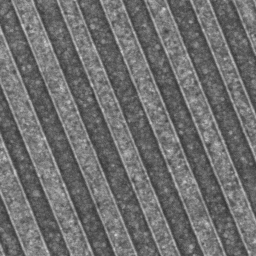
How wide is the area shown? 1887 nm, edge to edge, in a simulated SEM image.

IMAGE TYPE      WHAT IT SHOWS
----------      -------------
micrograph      parallel lines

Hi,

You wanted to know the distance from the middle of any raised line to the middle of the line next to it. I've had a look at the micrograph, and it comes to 0.302 µm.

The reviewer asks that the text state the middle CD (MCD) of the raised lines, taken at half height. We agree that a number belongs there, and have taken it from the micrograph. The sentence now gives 0.137 µm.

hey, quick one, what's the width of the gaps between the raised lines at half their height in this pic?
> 170 nm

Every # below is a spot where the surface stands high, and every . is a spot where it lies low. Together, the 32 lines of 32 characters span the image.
..##...###...##...###...##...###
..###...##...###...##...###...##
...##...##....##...###...##...##
...##....##...###...##...##....#
...###...##...###...##....##...#
#...##...###...##...###...##....
#...###...##...###...##....##...
##...##...##....##...###...##...
##...##....##...###...##...##...
##...###...##...###...###...##..
###...##...###...##...###...##..
.##...###...##...###...##....##.
.###...##...###...##...###...##.
.###...###...##...###...##...###
..##...###...##....##...###...##
..###...##....##...##...###...##
...##...###...##...###...##....#
...###...##...###...##...###...#
#..###...###...##...###...##...#
#...###...##...##....##...###...
#...###...##....##...##...###...
##...##...###...##...###...##...
##...###...##...###...##...###..
###...##...###...##...###...##..
###...###...##...##....##...###.
.###..###...##....##...###...##.
.###...##...###...##...###...##.
..##...###...##...###...##...###
..###...##...###...##...###...##
..###...###...##...##....##...##
...##...###...##....##...###...#
...###...##...###...##...###...#